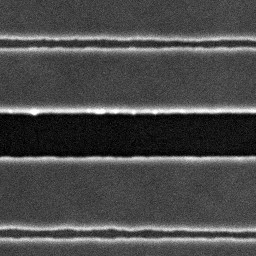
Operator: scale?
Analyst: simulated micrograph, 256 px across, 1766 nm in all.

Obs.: lines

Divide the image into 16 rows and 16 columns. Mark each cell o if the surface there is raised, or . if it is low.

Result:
oooooooooooooooo
oooooooooooooooo
oooooooooooooooo
oooooooooooooooo
oooooooooooooooo
oooooooooooooooo
oooooooooooooooo
................
................
................
oooooooooooooooo
oooooooooooooooo
oooooooooooooooo
oooooooooooooooo
oooooooooooooooo
oooooooooooooooo